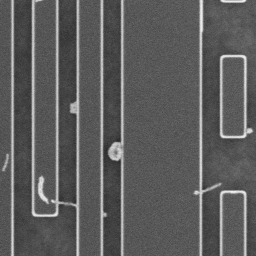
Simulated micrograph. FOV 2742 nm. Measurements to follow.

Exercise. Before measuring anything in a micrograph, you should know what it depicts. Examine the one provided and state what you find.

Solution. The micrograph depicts groups of lines, slits or small figures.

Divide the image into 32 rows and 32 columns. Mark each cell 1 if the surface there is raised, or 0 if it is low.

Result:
11001110001110011111111110000000
11001110001110011111111110000000
11001110001110011111111110000000
11001110001110011111111110000000
11001110001110011111111110000000
11001110001110011111111110000000
11001110001110011111111110000000
11001110001110011111111110001110
11001110001110011111111110001110
11001110001110011111111110001110
11001110001110011111111110001110
11001110001110011111111110001110
11001110001110011111111110001110
11001110011110011111111110001110
11001110001110011111111110001110
11001110001110011111111110001110
11001110001110011111111110001110
11001110001110011111111110000000
11001110001110111111111110000000
11001110001110111111111110000000
11001110001110011111111110000000
11001110001110011111111110000000
11001110001110011111111110000000
11001110001110011111111110000000
11001110001110011111111110001110
11001110001110011111111110001110
11001110001110011111111110001110
11000000001110011111111110001110
11000000001110011111111110001110
11000000001110011111111110001110
11000000001110011111111110001110
11000000001110011111111110001110